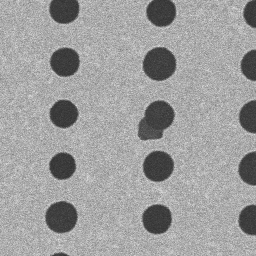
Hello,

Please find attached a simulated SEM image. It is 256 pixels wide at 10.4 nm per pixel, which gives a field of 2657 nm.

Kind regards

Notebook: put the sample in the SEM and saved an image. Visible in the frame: a regular array of holes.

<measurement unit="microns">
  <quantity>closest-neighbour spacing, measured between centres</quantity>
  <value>0.534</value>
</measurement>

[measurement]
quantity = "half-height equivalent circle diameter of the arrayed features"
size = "0.324 µm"